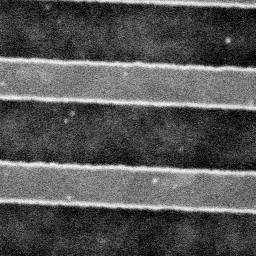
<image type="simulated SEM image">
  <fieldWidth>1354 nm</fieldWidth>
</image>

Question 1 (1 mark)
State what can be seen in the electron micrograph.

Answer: lines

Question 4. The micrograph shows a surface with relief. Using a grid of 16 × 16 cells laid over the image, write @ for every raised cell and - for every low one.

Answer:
----------------
----------------
----------------
----------------
@@@@@@@@@@@@@@@@
@@@@@@@@@@@@@@@@
---------@@@@@@@
----------------
----------------
----------------
@@@@@@@@@-------
@@@@@@@@@@@@@@@@
@@@@@@@@@@@@@@@@
----------------
----------------
----------------